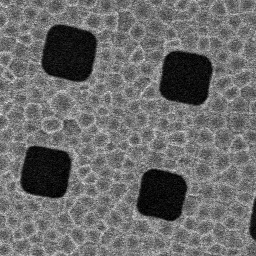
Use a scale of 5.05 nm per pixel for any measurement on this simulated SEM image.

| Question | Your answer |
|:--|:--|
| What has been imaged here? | holes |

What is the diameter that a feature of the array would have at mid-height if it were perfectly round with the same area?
273 nanometers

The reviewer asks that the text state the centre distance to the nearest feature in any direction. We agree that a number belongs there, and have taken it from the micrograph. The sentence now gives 600 nm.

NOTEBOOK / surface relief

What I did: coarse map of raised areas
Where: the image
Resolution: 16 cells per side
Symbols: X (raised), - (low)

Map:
XXXXXXXXXXXXXXXX
XXXXXXXXXXXXXXXX
XXX---XXXXXXXXXX
XXX---XXXX---XXX
XXX---XXXX---XXX
XXXXXXXXXX---XXX
XXXXXXXXXXXXXXXX
XXXXXXXXXXXXXXXX
XXXXXXXXXXXXXXXX
XX--XXXXXXXXXXXX
X---XXXXXXXXXXXX
X---XXXXX---XXXX
XXXXXXXXX---XXXX
XXXXXXXXX--XXXXX
XXXXXXXXXXXXXXXX
XXXXXXXXXXXXXXXX